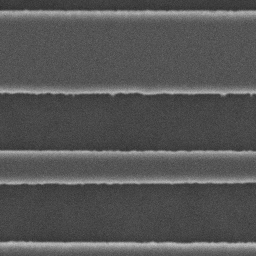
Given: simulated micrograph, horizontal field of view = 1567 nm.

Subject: lines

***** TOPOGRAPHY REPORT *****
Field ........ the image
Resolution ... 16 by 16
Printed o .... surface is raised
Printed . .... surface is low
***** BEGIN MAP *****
................
oooooooooooooooo
oooooooooooooooo
oooooooooooooooo
oooooooooooooooo
oooooooooooooooo
................
................
................
oooooooooooooooo
oooooooooooooooo
................
................
................
................
oooooooooooooooo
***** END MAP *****